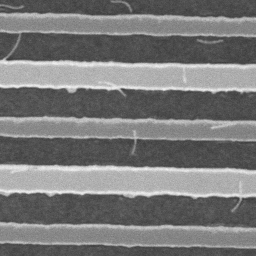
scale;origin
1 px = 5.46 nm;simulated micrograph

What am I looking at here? lines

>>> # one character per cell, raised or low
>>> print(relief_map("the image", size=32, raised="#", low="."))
................................
................................
################################
################################
............................#.##
................................
................................
#...............................
################################
################################
################################
................................
................................
................................
................................
################################
################################
.............................###
................................
................................
................................
################################
################################
################################
........................########
................................
................................
................................
############################....
################################
....############################
................................